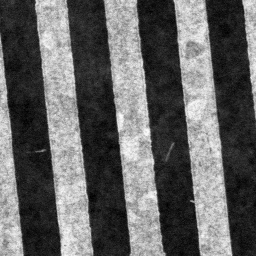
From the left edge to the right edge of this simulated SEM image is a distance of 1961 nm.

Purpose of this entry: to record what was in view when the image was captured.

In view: one or a few lines or trenches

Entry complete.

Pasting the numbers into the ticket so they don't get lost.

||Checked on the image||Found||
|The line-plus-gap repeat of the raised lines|520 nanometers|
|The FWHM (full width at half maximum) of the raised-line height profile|0.232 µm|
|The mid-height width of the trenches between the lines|0.293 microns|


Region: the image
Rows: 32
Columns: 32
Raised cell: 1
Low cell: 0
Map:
00000111000001111000001111000011
00000111000001111000001111000001
00000111000001111000001111000001
00000111100000111000001111000001
00000111100000111000001111000001
00000111100000111000001111000001
00000111100000111000000111000001
00000111100000111100000111000001
00000111100000111100000111000001
00000111100000111100000111100001
10000011100000111100000111100001
10000011100000111100000111100000
10000011100000111100000111100000
10000011110000011100000111100000
10000011110000011100000111100000
10000011110000011110000011100000
10000011110000011110000011100000
10000011110000011110000011100000
10000011110000011110000011110000
10000001110000011110000011110000
11000001110000011110000011110000
11000001110000011110000011110000
11000001111000001110000011110000
11000001111000001110000011110000
11000001111000001110000011110000
11000001111000001111000011110000
11000001111000001111000001110000
11000001111000001111000001110000
11100001111000001111000001111000
11100000111000001111000001111000
11000000111000001111000001111000
11100000111100001111000001111000